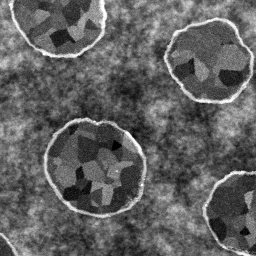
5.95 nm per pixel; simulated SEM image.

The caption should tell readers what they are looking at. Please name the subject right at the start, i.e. raised bodies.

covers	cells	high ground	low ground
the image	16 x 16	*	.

.*****..........
.*****......**..
..****.....****.
..........******
...........*****
...........****.
................
................
...*****........
...******.......
...******.......
...******.....**
....*****....***
.............***
.............***
*.............**